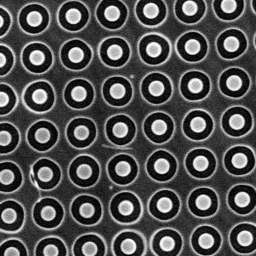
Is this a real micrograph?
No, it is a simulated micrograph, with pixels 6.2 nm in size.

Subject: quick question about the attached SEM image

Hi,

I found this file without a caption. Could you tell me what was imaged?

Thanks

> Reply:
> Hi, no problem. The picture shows an array of small figures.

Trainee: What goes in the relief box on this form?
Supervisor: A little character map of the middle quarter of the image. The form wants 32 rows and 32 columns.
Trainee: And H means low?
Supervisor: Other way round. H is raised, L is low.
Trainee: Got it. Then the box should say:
LLLLLHHHHHHLLLHHHHHHHHHHHHHHHHHH
HHLLHHHHHHHHHHHHHHHHHHHHHHHHHHHH
HHHHHHHHHHHHHHHHHHHHHLLLLHHHHHLL
HHHHHHHHHHHHLLLHHHHHLLLLLLHHHLLL
HLLLLLHHHHLLLLLLHHHLLLHHLLLHHLLL
HLLLLLLHHHLLHHHLLHHLLHHHHLLHHLLH
LLHHHLLHHHLLHHHLLHHLLHHHHLLHHLLL
LLHHHLLHHHLLHHHLLHHHLLHHLLLHHLLL
LLHHHLLHHHLLLHLLLHHHLLLLLLHHHHLL
LLLLLLLHHHHLLLLLHHHHHLLLLHHHHHHH
HLLLLLHHHHHHHLLHHHHHHHHHHHHHHHHH
HHHHHHHHHHHHHHHHHHHHHHHHHHHHHHHH
HHHHHHHHHHHHHHHHHHHHHHLLLHHHHHHL
HHHLLHHHHHHHLLLLLHHHHLLLLLLHHHLL
HHLLLLLHHHHLLLLLLHHHLLLHHLLHHHLL
HLLLLLLLHHLLLHHHLLHHLLHHHHLHHHLL
HLLHHHLLHHLLHHHHLLHHLLHHHLLHHHLL
HLLHHHLLHHHLLHHLLLHHLLLHHLLHHHLL
HLLHHLLLHHHLLLLLLHHHHLLLLLHHHHHL
HLLLLLLHHHHHLLLLLHHHHHLLLHHHHHHH
HHLLLLHHHHHHHHHHHHHHHHHHHHHHHHHH
HHHHHHHHHHHHHHHHHHHHHHHHHHHHHHHH
HHHHHHHHHHHHHHLHHHHHHHLLLLLHHHHL
HHHLLLLHHHHHLLLLLHHHHLLLLLLLHHHL
HHLLLLLLHHHLLLLLLLHHHLLHHHLLHHLL
HLLLHHLLLHHLLHHHLLHHLLLHHHLLHHLL
HLLHHHHLLHHLLHHHHLLHHLLHHHLLHHHL
HLLHHHHLLHHLLLHHLLHHHLLLLLLLHHHH
HHLLHHLLLHHHLLLLLLHHHHLLLLLHHHHH
HHLLLLLLHHHHHLLLLHHHHHHHHHHHHHHH
HHHHLLLHHHHHHHHHHHHHHHHHHHHHHHHH
HHHHHHHHHHHHHHHHHHHHHHHHHLHHHHHH